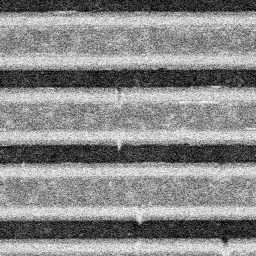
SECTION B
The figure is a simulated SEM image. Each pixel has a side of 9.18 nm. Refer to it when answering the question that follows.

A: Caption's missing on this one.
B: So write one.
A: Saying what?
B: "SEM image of one or a few lines or trenches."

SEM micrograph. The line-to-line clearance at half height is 36.1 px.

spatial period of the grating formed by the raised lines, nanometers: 694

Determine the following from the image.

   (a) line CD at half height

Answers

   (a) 39.6 px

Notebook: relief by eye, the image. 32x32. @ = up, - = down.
--------------------------------
--------------------------------
--------------------------------
@@@@@@@@@@@@@@@@@@@@@@@@@@@@@@@@
@@@@@@@@@@@@@@@@@@@@@@@@@@@@@@@@
@@@@@@@@@@@@@@@@@@@@@@@@@@@@@@@@
@@@@@@@@@@@@@@@@@@@@@@@@@@@@@@@@
@@@@@@@@@@@@@@@@------------@@@@
--------------------------------
--------------------------------
--------------------------------
--------------------------------
@@@@@@@@@@@@@@@@@@@@@@@@@@@@@@@@
@@@@@@@@@@@@@@@@@@@@@@@@@@@@@@@@
@@@@@@@@@@@@@@@@@@@@@@@@@@@@@@@@
@@@@@@@@@@@@@@@@@@@@@@@@@@@@@@@@
@@@@@@@@@@@@@@@@@@@@@@@@@@@@@@@@
--------------------------------
--------------------------------
--------------------------------
--------------------------------
--@---------------------------@@
@@@@@@@@@@@@@@@@@@@@@@@@@@@@@@@@
@@@@@@@@@@@@@@@@@@@@@@@@@@@@@@@@
@@@@@@@@@@@@@@@@@@@@@@@@@@@@@@@@
@@@@@@@@@@@@@@@@@@@@@@@@@@@@@@@@
-----------------@--------------
--------------------------------
--------------------------------
--------------------------------
--------------------------------
@@@@@@@@@@@@@@@@@@@@@@@@@@@@@@@@